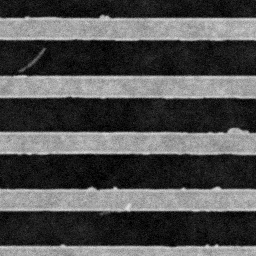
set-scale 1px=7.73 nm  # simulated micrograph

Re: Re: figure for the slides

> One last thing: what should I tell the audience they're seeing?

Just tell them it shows lines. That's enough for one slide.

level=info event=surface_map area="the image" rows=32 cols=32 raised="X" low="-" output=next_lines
--------------------------------
--------------------------------
XXXXXXXXXXXXXXXXXXXXXXXXXXXXXXXX
XXXXXXXXXXXXXXXXXXXXXXXXXXXXXXXX
XXXXXXXXXXXXXXXXXXXXXXXXXXXXXXXX
--------------------------------
--------------------------------
--------------------------------
--------------------------------
--------------------------------
XXXXXXXXXXXXXXXXXXXXXXXXXXXXXXXX
XXXXXXXXXXXXXXXXXXXXXXXXXXXXXXXX
--------------------------------
--------------------------------
--------------------------------
--------------------------------
-----------------------------X--
XXXXXXXXXXXXXXXXXXXXXXXXXXXXXXXX
XXXXXXXXXXXXXXXXXXXXXXXXXXXXXXXX
--------------------------------
--------------------------------
--------------------------------
--------------------------------
--------------------------------
XXXXXXXXXXXXXXXXXXXXXXXXXXXXXXXX
XXXXXXXXXXXXXXXXXXXXXXXXXXXXXXXX
--------------------------------
--------------------------------
--------------------------------
--------------------------------
--------------------------------
XXXXXXXXXXXXXXXXXXXXXXXXXXXXXXXX